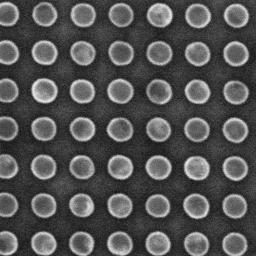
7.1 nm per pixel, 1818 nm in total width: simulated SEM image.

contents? a regular array of raised bodies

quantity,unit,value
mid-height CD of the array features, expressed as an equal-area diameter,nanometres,166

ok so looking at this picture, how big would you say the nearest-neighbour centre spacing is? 0.268 micrometres